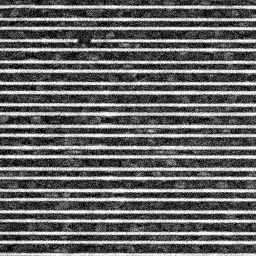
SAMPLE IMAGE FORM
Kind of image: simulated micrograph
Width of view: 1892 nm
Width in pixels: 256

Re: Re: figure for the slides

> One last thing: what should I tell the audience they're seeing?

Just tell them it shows parallel lines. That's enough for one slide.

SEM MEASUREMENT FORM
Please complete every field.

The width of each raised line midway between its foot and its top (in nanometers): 17.6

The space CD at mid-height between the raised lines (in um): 0.049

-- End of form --